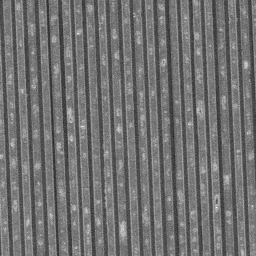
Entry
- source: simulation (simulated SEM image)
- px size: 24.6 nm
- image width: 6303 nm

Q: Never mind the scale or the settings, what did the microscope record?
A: parallel lines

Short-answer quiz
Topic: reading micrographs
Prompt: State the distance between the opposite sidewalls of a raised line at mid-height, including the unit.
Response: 0.175 µm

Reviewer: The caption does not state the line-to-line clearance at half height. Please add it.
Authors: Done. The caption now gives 108 nm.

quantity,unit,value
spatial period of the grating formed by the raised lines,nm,291